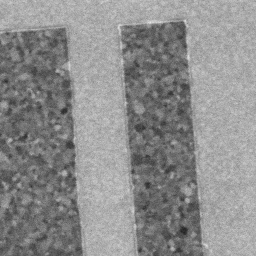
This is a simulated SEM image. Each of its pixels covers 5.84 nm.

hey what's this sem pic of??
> one or a few lines or trenches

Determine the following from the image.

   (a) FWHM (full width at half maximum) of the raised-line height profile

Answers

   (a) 389 nm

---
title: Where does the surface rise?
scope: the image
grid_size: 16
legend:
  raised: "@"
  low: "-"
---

----------------
--------@@@-----
@@@@----@@@@----
@@@@----@@@@----
@@@@----@@@@----
@@@@----@@@@----
@@@@@---@@@@----
@@@@@---@@@@----
@@@@@---@@@@----
@@@@@---@@@@----
@@@@@---@@@@----
@@@@@---@@@@----
@@@@@---@@@@----
@@@@@---@@@@@---
@@@@@---@@@@@---
@@@@@----@@@@---